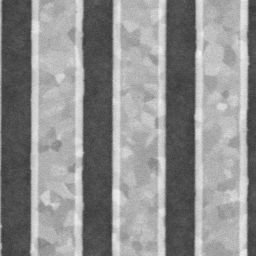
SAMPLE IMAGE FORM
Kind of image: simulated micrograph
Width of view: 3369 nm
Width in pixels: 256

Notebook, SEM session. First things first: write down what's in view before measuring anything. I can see one or a few lines or trenches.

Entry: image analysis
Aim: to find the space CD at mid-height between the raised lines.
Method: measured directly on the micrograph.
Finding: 484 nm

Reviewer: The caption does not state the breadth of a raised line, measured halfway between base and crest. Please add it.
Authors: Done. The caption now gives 595 nm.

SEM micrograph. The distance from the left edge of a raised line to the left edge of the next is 1080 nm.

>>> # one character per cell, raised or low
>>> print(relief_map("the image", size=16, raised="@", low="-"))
--@@@--@@@--@@@-
--@@@--@@@--@@@-
--@@@--@@@--@@@-
--@@@--@@@--@@@-
--@@@--@@@--@@@-
--@@@--@@@--@@@-
--@@@--@@@--@@@-
--@@@--@@@--@@@-
--@@@--@@@--@@@-
--@@@--@@@--@@@-
--@@@--@@@--@@@-
--@@@--@@@--@@@-
--@@@--@@@--@@@-
--@@@--@@@--@@@-
--@@@--@@@--@@@-
--@@@--@@@--@@@-